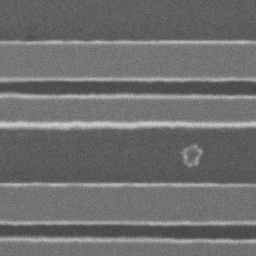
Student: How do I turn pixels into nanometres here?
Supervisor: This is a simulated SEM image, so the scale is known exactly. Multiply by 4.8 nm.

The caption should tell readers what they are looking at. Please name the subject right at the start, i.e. lines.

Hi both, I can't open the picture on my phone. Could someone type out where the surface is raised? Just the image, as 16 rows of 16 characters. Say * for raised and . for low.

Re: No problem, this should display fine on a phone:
................
................
................
****************
****************
****************
****************
****************
................
................
................
................
****************
****************
****************
****************